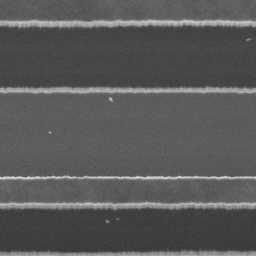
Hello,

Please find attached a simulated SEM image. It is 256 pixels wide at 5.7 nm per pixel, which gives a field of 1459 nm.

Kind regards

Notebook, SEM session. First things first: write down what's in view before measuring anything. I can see lines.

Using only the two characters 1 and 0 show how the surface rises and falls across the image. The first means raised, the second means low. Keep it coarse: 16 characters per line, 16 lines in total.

1111111111111111
0000000000000000
0000000000000000
0000000000000000
0000000000000000
0000000000000000
1111111111111111
1111111111111111
1111111111111111
1111111111111111
1111111111111111
1111111111111111
1111111111111111
0000000000000000
0000000000000000
0000000000000000